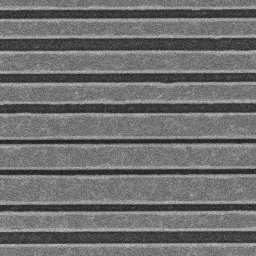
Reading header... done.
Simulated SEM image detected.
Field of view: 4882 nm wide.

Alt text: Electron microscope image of parallel lines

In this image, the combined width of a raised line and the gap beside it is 614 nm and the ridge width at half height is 401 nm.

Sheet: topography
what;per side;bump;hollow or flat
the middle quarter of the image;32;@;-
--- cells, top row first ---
@@@@@@@@@@@@@@@@@@@@@@@@@@@@@@@@
@@@@@@@@@@@@@@@@@@@@@@@@@@@@@@@@
--------------------------------
--------------------------------
--------------------------------
@@@@@@@@@@@@@@@@@@@@@@@@@@@@@@@@
@@@@@@@@@@@@@@@@@@@@@@@@@@@@@@@@
@@@@@@@@@@@@@@@@@@@@@@@@@@@@@@@@
@@@@@@@@@@@@@@@@@@@@@@@@@@@@@@@@
@@@@@@@@@@----------------------
--------------------------------
--------------------------------
----------@--------------------@
@@@@@@@@@@@@@@@@@@@@@@@@@@@@@@@@
@@@@@@@@@@@@@@@@@@@@@@@@@@@@@@@@
@@@@@@@@@@@@@@@@@@@@@@@@@@@@@@@@
@@@@@@@@@@@@@@@@@@@@@@@@@@@@@@@@
@@@@@@@@@@@@@@@@@@@@@@@@@@@@@@@@
@@@@@@@@@@----------------------
--------------------------------
@@@@@-----@@@@@@@@@@@@@@@@@@@@@@
@@@@@@@@@@@@@@@@@@@@@@@@@@@@@@@@
@@@@@@@@@@@@@@@@@@@@@@@@@@@@@@@@
@@@@@@@@@@@@@@@@@@@@@@@@@@@@@@@@
@@@@@@@@@@@@@@@@@@@@@@@@@@@@@@@@
@@@@@@@@@@@@@@@@@@@@@@@@@@@@@@@@
--------------------------------
--------------------------------
@@@@@@@@@@@@@@@@@@@@@@@@@@@@@@@@
@@@@@@@@@@@@@@@@@@@@@@@@@@@@@@@@
@@@@@@@@@@@@@@@@@@@@@@@@@@@@@@@@
@@@@@@@@@@@@@@@@@@@@@@@@@@@@@@@@